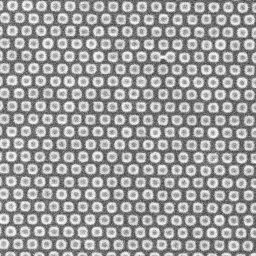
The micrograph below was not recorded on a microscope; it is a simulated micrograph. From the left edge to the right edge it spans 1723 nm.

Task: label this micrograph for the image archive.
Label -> a regular array of raised bodies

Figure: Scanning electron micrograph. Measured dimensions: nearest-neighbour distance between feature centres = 94.3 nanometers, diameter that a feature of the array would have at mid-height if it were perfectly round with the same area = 64.9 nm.